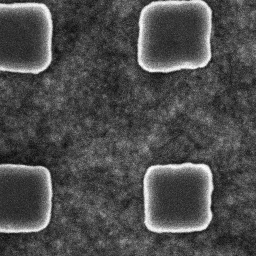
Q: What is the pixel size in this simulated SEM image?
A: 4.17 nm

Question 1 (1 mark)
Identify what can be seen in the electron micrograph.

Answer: raised bodies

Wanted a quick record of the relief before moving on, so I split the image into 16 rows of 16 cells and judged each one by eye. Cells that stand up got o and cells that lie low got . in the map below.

ooo......oooo...
ooo......oooo...
ooo......oooo...
ooo......oooo...
.o..............
................
................
................
................
................
ooo.......ooo...
ooo......oooo...
ooo......oooo...
ooo......oooo...
................
................